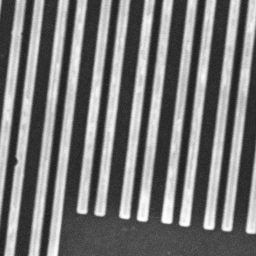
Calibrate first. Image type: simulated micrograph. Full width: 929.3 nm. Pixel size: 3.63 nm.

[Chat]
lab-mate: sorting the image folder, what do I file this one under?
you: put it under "parallel lines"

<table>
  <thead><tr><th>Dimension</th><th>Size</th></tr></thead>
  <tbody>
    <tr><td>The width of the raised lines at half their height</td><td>28.8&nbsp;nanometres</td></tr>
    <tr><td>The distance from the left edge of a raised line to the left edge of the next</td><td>76.8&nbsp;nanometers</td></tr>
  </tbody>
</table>